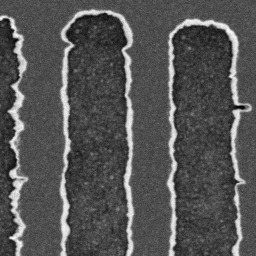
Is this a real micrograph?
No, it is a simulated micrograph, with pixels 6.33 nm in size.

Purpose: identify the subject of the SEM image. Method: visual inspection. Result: one or a few lines or trenches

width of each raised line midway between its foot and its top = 0.284 um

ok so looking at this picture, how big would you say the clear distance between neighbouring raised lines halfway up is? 396 nanometres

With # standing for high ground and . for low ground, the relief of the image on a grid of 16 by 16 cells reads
################
.###....####.###
.###....###....#
.###....###....#
.###....###....#
.###....###....#
.###....###....#
.###....###....#
.###....###....#
.###....###....#
.###....###....#
.###....###....#
.###....###....#
.###....###....#
.###....###....#
.###....###....#